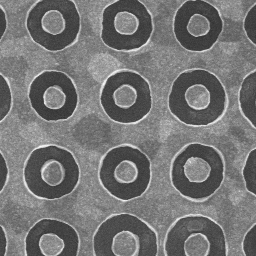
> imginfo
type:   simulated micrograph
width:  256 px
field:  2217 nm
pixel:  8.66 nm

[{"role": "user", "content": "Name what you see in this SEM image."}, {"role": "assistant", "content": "ring-shaped grooves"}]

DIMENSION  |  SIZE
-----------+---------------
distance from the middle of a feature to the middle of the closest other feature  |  622 nm